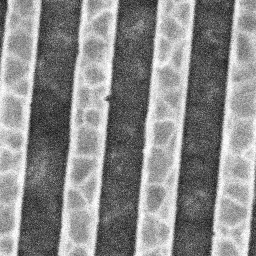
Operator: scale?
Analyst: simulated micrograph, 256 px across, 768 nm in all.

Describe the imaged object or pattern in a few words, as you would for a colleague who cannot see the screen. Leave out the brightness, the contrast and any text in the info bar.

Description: one or a few lines or trenches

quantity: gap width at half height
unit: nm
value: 131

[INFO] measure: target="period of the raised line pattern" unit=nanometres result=229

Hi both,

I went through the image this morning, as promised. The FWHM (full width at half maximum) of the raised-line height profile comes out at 33.1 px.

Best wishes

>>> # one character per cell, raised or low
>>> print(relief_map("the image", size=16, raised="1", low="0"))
0100011000110001
1100011000110001
1100011000110001
1100011000110011
1100011000110011
1100011000110011
1100011001100011
1100011001100011
1100111001100011
1100110001100011
1000110001100011
1000110001100011
1000110001100011
1000110001100011
1000110001100111
1000110001100110